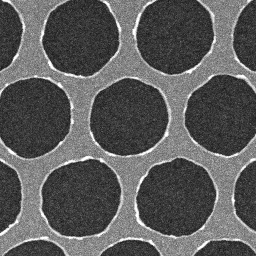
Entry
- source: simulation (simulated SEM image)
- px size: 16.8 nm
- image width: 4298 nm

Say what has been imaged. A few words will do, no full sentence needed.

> holes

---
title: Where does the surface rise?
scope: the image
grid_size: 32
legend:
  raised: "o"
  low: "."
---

.ooooooo.....oooooo......oooooo.
..oooo........oooo........oooo..
...ooo........ooo.........oooo..
...ooo.........oo..........oo...
...oo..........oo..........oo...
...oo..........oo..........oo...
..oooo.........oo.........ooo...
..oooo........oooo.......ooooo..
.oooooo......oooooo.....ooooooo.
oooooooooo.oooooooooooooooo..ooo
o......ooooooo....ooooooo......o
........oooo........oooo........
.........ooo.........oo.........
.........oo..........oo.........
.........oo..........oo.........
.........oo..........oo.........
.........oo..........ooo........
........oooo........oooo.......o
o......oooooo......ooooooo.....o
oo...oooooooooo.oooooooooooooooo
.ooooooo.....ooooooo.....oooooo.
..oooo........ooooo.......oooo..
..oooo.........ooo.........ooo..
...oo..........oo..........oo...
...oo..........oo..........oo...
...oo..........oo..........oo...
...oo..........oo..........oo...
..oooo........oooo........oooo..
.ooooo.......oooooo......oooooo.
oooooooo...ooooooooooo.ooooooooo
ooo....ooooooo.....ooooooo.....o
o.......ooooo.......ooooo.......